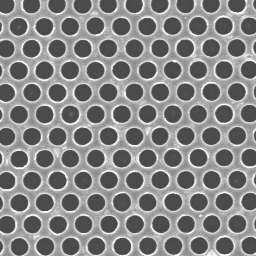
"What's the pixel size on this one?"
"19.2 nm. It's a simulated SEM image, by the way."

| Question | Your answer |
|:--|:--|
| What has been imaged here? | a regular array of holes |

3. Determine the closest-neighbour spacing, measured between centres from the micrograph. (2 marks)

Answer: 484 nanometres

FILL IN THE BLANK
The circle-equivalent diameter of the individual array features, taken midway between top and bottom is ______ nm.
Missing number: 339